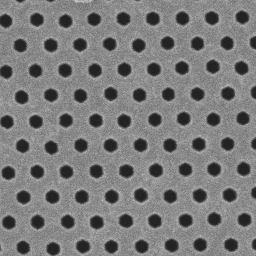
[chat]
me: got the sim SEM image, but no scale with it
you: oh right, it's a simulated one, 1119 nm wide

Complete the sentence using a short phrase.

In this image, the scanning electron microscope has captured a regular array of holes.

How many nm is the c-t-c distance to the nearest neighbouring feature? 124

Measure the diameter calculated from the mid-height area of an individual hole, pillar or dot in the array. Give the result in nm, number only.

59.8